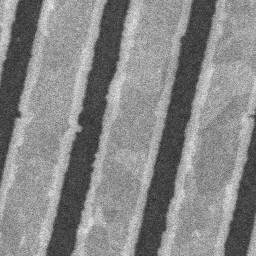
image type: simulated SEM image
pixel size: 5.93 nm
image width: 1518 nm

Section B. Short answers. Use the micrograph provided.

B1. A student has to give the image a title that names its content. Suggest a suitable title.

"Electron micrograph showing one or a few lines or trenches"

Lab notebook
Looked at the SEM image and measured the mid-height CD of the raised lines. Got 52.2 px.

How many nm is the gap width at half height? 196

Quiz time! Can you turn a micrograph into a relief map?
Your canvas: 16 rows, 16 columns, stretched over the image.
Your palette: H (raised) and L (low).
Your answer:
HLLHHHLLHHHHLLHH
HLLHHHLLHHHLLLHH
LLHHHHLLHHHLLHHH
LLHHHHLLHHHLLHHH
LLHHHLLHHHHLLHHH
LLHHHLLHHHLLLHHH
LHHHHLLHHHLLHHHH
LHHHHLLHHHLLHHHH
LHHHLLLHHHLLHHHL
LHHHLLHHHHLLHHHL
LHHHLLHHHLLHHHHL
HHHHLLHHHLLHHHHL
HHHLLLHHHLLHHHLL
HHHLLHHHHLLHHHLL
HHHLLHHHLLLHHHLL
HHHLLHHHLLHHHHLL